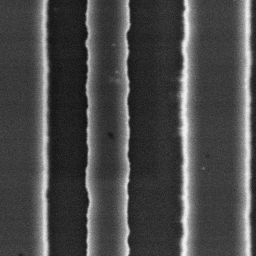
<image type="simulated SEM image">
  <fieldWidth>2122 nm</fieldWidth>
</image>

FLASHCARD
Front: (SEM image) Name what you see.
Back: lines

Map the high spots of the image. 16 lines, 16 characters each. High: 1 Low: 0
1110011100001110
1110011100001110
1110011100001110
1110001100001110
1110001100001110
1110011100001110
1110001100001110
1110011100001110
1110011100001110
1110001100001110
1110011100001110
1110011100001110
1110001100001110
1110011100001110
1110011100001110
1110011100001110